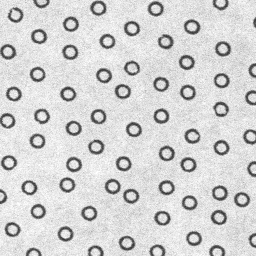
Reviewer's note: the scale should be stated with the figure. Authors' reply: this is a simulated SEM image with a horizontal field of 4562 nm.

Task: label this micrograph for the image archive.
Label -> a regular array of ring-shaped grooves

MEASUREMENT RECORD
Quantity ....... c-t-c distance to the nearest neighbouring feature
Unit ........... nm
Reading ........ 506